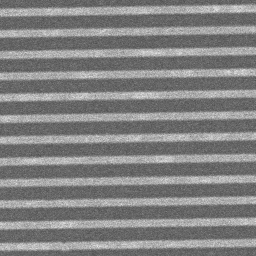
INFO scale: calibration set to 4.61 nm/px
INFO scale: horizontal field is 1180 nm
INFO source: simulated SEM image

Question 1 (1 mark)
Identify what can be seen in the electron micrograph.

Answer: parallel lines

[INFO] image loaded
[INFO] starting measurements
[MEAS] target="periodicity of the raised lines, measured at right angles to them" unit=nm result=98.3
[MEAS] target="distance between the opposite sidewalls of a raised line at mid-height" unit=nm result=35.2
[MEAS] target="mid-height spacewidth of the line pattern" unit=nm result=62.3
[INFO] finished